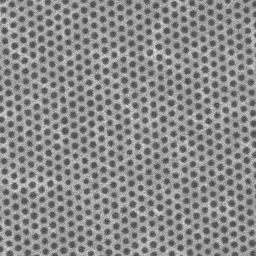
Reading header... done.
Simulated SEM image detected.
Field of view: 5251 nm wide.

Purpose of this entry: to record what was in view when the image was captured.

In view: a regular array of holes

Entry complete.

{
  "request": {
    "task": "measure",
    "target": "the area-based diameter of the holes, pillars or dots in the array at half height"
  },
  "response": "150 nanometers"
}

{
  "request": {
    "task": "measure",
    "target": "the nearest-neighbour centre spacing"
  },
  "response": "208 nm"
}